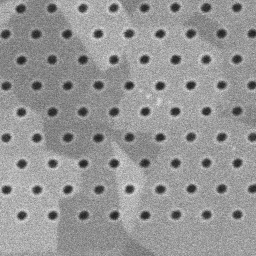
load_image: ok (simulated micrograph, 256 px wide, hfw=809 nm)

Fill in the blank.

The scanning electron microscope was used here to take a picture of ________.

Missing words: a regular array of holes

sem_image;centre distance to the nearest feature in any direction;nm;93.6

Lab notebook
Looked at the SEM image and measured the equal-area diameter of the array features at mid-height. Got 0.0343 micrometres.